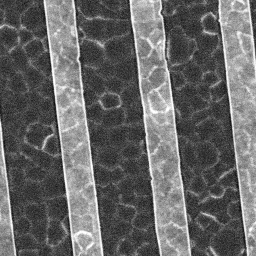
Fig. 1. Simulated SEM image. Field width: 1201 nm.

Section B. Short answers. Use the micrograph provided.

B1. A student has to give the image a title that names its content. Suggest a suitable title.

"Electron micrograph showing one or a few lines or trenches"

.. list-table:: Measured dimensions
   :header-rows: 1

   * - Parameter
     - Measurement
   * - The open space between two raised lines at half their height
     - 267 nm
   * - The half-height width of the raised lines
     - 28.4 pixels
